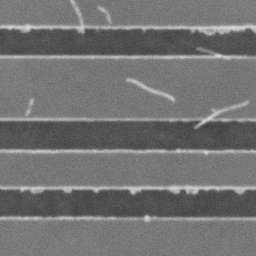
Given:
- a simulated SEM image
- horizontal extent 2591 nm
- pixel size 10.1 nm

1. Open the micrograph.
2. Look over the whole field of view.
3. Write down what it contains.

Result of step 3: lines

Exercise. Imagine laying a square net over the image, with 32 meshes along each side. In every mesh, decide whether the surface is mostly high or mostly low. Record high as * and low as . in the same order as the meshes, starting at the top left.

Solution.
********************************
********************************
********************************
...*....*.*.****...***.*******..
................................
................................
................................
********************************
********************************
********************************
********************************
********************************
********************************
********************************
********************************
................................
................................
................................
................................
********************************
********************************
********************************
********************************
********************************
................................
................................
................................
********************************
********************************
********************************
********************************
********************************